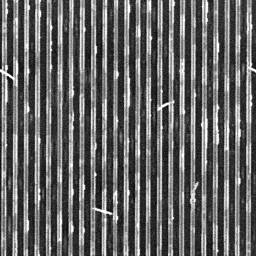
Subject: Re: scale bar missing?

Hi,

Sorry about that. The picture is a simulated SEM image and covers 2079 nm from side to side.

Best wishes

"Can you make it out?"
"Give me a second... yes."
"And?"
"parallel lines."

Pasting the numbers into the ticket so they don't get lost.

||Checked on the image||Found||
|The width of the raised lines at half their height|3.5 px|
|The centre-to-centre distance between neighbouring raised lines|90.3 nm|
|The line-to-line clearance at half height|56.8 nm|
